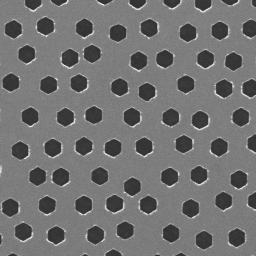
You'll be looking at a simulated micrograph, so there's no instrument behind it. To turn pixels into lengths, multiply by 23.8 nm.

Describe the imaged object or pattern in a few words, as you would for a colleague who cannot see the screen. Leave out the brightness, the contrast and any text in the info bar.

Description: a regular array of holes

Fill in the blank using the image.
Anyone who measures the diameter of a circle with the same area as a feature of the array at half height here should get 415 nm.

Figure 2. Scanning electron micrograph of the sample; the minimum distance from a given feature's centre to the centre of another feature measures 700 nm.